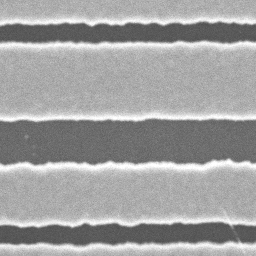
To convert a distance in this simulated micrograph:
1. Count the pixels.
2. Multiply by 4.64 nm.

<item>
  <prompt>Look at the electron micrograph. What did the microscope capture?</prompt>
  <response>lines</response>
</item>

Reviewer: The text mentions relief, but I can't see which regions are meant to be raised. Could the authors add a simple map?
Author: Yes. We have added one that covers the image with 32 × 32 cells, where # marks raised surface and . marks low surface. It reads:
################################
################################
################################
................................
................................
################################
################################
################################
################################
################################
################################
################################
################################
################################
################################
................................
................................
................................
................................
................................
..##...##....#....####....######
################################
################################
################################
################################
################################
################################
################################
................................
................................
#...##.....##..##.##.###########
################################